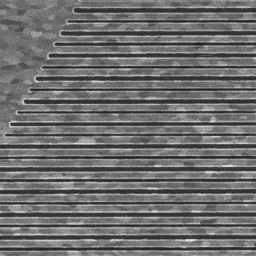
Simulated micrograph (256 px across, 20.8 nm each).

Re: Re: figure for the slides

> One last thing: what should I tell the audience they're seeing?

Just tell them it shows parallel lines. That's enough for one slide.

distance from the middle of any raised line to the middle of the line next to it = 237 nm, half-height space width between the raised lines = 78.1 nm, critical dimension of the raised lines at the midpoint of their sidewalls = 151 nm